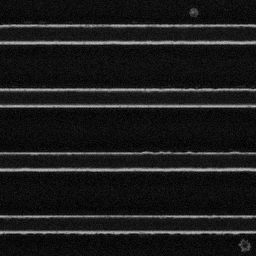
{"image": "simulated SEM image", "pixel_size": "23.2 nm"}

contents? lines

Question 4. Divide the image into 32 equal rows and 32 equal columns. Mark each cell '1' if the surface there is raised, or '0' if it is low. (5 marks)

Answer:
00000000000000000000000000000000
00000000000000000000000000000000
00000000000000000000000000000000
11111111111111111111111111111111
11111111111111111111111111111111
00000000000000000000000000000000
00000000000000000000000000000000
00000000000000000000000000000000
00000000000000000000000000000000
00000000000000000000000000000000
00000000000000000000000000000000
11111111111111111111111111111111
11111111111111111111111111111111
00000000000000000000000000000000
00000000000000000000000000000000
00000000000000000000000000000000
00000000000000000000000000000000
00000000000000000000000000000000
00000000000000000000000000000000
11111111111111111111111111111111
11111111111111111111111111111111
00000000000000000000000000000000
00000000000000000000000000000000
00000000000000000000000000000000
00000000000000000000000000000000
00000000000000000000000000000000
00000000000000000000000000000000
11111111111111111111111111111111
11111111111111111111111111111111
00000000000000000000000000000000
00000000000000000000000000000000
00000000000000000000000000000000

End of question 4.